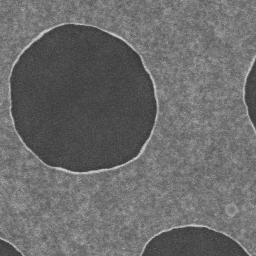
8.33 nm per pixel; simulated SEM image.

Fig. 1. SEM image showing holes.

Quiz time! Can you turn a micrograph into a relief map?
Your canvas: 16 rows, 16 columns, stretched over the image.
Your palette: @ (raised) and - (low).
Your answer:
@@@@@@@@@@@@@@@@
@@@@-@@@@@@@@@@@
@@------@@@@@@@@
@--------@@@@@@@
@--------@@@@@@@
@---------@@@@@-
@---------@@@@@-
@---------@@@@@@
@--------@@@@@@@
@@-------@@@@@@@
@@@@---@@@@@@@@@
@@@@@@@@@@@@@@@@
@@@@@@@@@@@@@@@@
@@@@@@@@@@@@@@@@
@@@@@@@@@@----@@
-@@@@@@@@------@